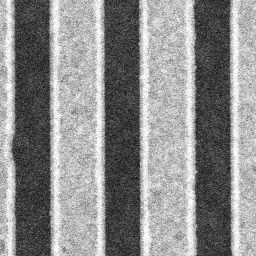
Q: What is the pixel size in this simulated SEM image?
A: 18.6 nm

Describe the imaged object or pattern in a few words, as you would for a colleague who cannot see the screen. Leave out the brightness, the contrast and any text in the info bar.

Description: one or a few lines or trenches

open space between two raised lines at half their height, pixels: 47.2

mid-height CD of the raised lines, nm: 792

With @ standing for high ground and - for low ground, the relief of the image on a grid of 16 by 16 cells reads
@---@@---@@@---@
@---@@---@@@---@
@---@@---@@@---@
----@@---@@@---@
----@@---@@@---@
@---@@---@@@---@
----@@---@@@---@
@---@@---@@@---@
----@@---@@@---@
----@@---@@@---@
@---@@---@@@---@
@---@@---@@@---@
@---@@---@@@---@
@---@@---@@@---@
@---@@---@@@---@
@---@@---@@@---@